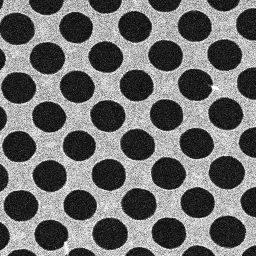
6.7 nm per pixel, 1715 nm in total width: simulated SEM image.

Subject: a regular array of holes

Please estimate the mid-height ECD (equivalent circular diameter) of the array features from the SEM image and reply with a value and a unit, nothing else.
221 nanometres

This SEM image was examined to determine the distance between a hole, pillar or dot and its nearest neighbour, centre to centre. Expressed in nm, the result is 278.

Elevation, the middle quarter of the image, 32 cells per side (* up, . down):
*******.......*********......***
********.....****...****....***.
*.....*********......*********..
.......*******........*******...
.......*******........*******...
........******........******....
........******........*******...
.......********.......*******...
.......*********.....**********.
**...****....**********.....****
*******.......********.......***
*******........*******........**
*******........******.........**
.******........*******........**
*******........*******........**
********.......********......***
*********....****...****...****.
*.....*********......*********..
.......*******........*******...
........******.........******...
........******.........******...
........******.........******...
.......********.......********..
**....**********.....***...*****
*********.....*********......***
********.......*******........**
*******........*******........**
.******........*******........**
.******........*******........**
*******........*******........**
********.......********......***
***..*****...****....**********.